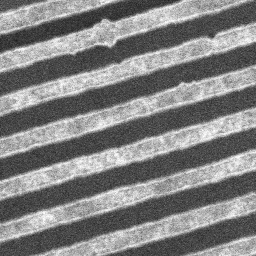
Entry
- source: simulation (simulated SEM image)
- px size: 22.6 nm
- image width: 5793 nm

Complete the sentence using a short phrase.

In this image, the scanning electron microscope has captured parallel lines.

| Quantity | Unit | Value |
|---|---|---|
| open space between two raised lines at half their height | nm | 517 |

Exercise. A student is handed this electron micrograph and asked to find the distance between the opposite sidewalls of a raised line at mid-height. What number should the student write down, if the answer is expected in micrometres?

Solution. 0.394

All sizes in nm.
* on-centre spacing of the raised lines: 919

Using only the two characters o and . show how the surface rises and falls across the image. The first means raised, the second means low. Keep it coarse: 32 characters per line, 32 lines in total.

....ooooooooo.........oooooooo..
.ooooooooo........ooooooooo.....
oooooo.........oooooooo.........
ooo........oooooooo...........oo
........oooooooo...........ooooo
....oooooooooo.........oooooooo.
.ooooooooo.........ooooooooo....
ooooo...........oooooooo........
oo...........ooooooo...........o
.........oooooooo...........oooo
.....ooooooooo.........ooooooooo
..oooooooo..........oooooooo....
oooooo...........oooooooo.......
ooo...........ooooooo...........
..........oooooooo..........oooo
......oooooooo............oooooo
...oooooooo..........oooooooo...
oooooooo..........oooooooo......
oooo...........oooooooo.........
o..........oooooooo...........oo
.......ooooooooo...........ooooo
....oooooooo...........oooooooo.
oooooooo............ooooooo.....
ooooo..........oooooooo.........
o...........oooooooo...........o
.........ooooooo...........ooooo
.....oooooooo...........oooooooo
..oooooooo..........oooooooo....
oooooo..........ooooooooo.......
ooo..........oooooooo...........
..........oooooooo..........oooo
......ooooooooo..........ooooooo